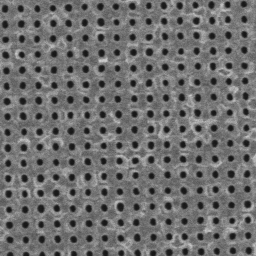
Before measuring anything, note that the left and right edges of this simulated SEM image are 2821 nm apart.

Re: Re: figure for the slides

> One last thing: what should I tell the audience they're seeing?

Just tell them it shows a regular array of holes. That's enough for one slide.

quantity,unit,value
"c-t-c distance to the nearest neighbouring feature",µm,0.167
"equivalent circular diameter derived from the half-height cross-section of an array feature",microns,0.0766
